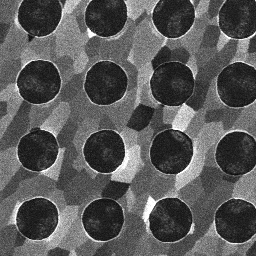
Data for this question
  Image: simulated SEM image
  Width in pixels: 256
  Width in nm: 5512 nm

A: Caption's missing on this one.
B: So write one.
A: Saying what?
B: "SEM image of a regular array of holes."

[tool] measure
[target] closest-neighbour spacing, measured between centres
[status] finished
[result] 1430 nm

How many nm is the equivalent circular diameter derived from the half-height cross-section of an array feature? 944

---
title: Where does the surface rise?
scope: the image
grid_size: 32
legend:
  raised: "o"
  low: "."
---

ooo.....ooo.....oooo....oooo....
oo......ooo.....ooo.....ooo.....
oo......ooo.....ooo.....ooo.....
o.o....oooo....oooo.....oooo....
oooo..oooooo..ooooooo..ooooo...o
oooooooooooooooooooooooooooooooo
oooooooooooooooooooooooooooooooo
oooooooooooooooooooooooooooooooo
ooo....oooo....ooooo....oooo....
oo......ooo.....ooo.....ooo.....
oo......ooo.....ooo.....ooo.....
oo.....oooo.....ooo.....ooo.....
ooo...ooooo....ooooo...ooooo....
oooooooooooooooooooooooooooooooo
oooooooooooooooooooooooooooooooo
oooooooooooooooooooooooooooooooo
oooo..oooooo..oooooo...oooooo..o
ooo....oooo....oooo.....oooo....
oo.....ooo......ooo.....ooo.....
oo.....ooo......ooo.....ooo.....
ooo....oooo....oooo.....ooo.....
oooooooooooo..oooooo...ooooo...o
oooooooooooooooooooooooooooooooo
oooooooooooooooooooooooooooooooo
oooooooooooooooooooooooooooooooo
ooo....oooo....oooo....ooooo....
oo.....ooo.....oooo.....ooo.....
oo.....ooo.....oooo.....ooo.....
oo.....oooo....oooo.....ooo.....
ooo...ooooo....oooo....ooooo....
oooooooooooooooooooooooooooooooo
oooooooooooooooooooooooooooooooo